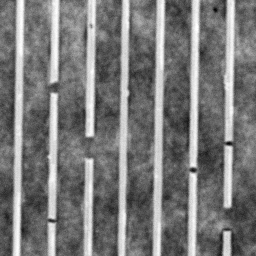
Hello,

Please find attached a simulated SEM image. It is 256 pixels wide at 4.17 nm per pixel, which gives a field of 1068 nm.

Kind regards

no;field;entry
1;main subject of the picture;parallel lines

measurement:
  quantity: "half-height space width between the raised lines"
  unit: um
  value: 0.118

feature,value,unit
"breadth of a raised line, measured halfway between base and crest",0.0276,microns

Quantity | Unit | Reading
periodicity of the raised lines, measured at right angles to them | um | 0.146